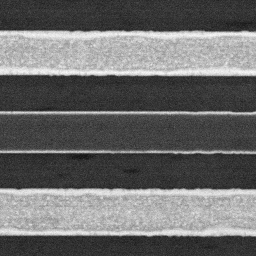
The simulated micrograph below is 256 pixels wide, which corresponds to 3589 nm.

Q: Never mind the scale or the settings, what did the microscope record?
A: lines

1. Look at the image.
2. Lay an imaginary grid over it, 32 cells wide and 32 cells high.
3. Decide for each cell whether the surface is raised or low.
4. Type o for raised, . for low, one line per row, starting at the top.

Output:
................................
................................
................................
................................
oooooooooooooooooooooooooooooooo
oooooooooooooooooooooooooooooooo
oooooooooooooooooooooooooooooooo
oooooooooooooooooooooooooooooooo
oooooooooooooooooooooooooooooooo
................................
................................
................................
................................
................................
oooooooooooooooooooooooooooooooo
oooooooooooooooooooooooooooooooo
oooooooooooooooooooooooooooooooo
oooooooooooooooooooooooooooooooo
oooooooooooooooooooooooooooooooo
................................
................................
................................
................................
................................
oooooooooooooooooooooooooooooooo
oooooooooooooooooooooooooooooooo
oooooooooooooooooooooooooooooooo
oooooooooooooooooooooooooooooooo
oooooooooooooooooooooooooooooooo
................................
................................
................................